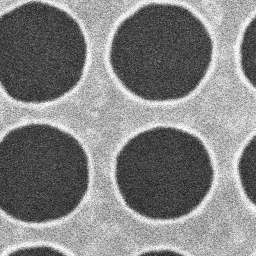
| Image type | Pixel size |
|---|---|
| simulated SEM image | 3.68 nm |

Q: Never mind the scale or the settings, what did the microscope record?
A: holes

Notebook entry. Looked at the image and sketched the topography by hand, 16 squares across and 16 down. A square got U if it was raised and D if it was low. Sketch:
UDDDUUUUUDDDUUUU
DDDDDUUDDDDDDUUU
DDDDDUUDDDDDDUUD
DDDDDUUDDDDDDUUD
DDDDDUUDDDDDDUUD
DDDDDUUUDDDDUUUU
UUUUUUUUUUUUUUUU
UUUUUUUUUUUUUUUU
DDDDDUUUDDDDUUUU
DDDDDUUDDDDDDUUD
DDDDDDUDDDDDDUUD
DDDDDDUDDDDDDUUD
DDDDDUUUDDDDDUUU
UDDDUUUUUDDDUUUU
UUUUUUUUUUUUUUUU
UDDUUUUUUUUUUUUU